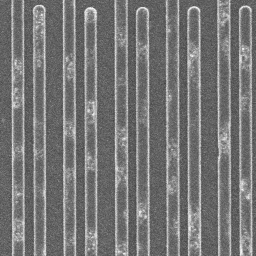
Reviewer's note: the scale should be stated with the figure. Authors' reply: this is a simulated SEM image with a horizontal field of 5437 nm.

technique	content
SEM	parallel lines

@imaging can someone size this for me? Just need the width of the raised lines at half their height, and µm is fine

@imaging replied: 0.263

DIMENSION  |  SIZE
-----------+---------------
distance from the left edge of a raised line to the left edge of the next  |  537 nm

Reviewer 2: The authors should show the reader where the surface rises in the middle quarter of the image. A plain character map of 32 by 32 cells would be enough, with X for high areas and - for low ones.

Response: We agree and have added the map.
XXX--XXX-----XXX--XXX-----XXX--X
XXX--XXX-----XXX--XXX-----XXX--X
XXX--XXX-----XXX--XXX-----XXX--X
XXX--XXX-----XXX--XXX-----XXX--X
XXX--XXX-----XXX--XXX-----XXX--X
XXX--XXX-----XXX--XXX-----XXX--X
XXX--XXX-----XXX--XXX-----XXX--X
XXX--XXX-----XXX--XXX-----XXX--X
XXX--XXX-----XXX--XXX-----XXX--X
XXX--XXX-----XXX--XXX-----XXX--X
XXX--XXX-----XXX--XXX-----XXX--X
XXX--XXX-----XXX--XXX-----XXX--X
XXX--XXX-----XXX--XXX-----XXX--X
XXX--XXX-----XXX--XXX-----XXX--X
XXX--XXX-----XXX--XXX-----XXX--X
XXX--XXX-----XXX--XXX-----XXX--X
XXX--XXX-----XXX--XXX-----XXX--X
XXX--XXX-----XXX--XXX-----XXX--X
XXX--XXX-----XXX--XXX-----XXX--X
XXX--XXX-----XXX--XXX-----XXX--X
XXX--XXX-----XXX--XXX-----XXX--X
XXX--XXX-----XXX--XXX-----XXX--X
XXX--XXX-----XXX--XXX-----XXX--X
XXX--XXX-----XXX--XXX-----XXX--X
XXX--XXX-----XXX--XXX-----XXX--X
XXX--XXX-----XXX--XXX-----XXX--X
XXX--XXX-----XXX--XXX-----XXX--X
XXX--XXX-----XXX--XXX-----XXX--X
XXX--XXX-----XXX--XXX-----XXX--X
XXX--XXX-----XXX--XXX-----XXX--X
XXX--XXX-----XXX--XXX-----XXX--X
XXX--XXX-----XXX--XXX-----XXX--X